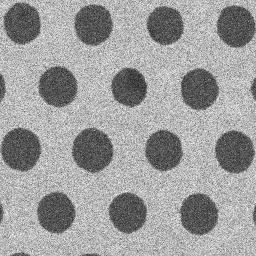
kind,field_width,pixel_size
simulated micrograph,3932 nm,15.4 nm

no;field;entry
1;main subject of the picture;a regular array of holes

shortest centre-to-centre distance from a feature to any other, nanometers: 1090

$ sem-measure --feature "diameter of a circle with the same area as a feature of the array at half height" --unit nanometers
625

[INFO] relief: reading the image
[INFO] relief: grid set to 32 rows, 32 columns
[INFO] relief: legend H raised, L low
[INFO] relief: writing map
HHLLHHHHHHHLHHHHHHHHHHHHHHHHHHHH
HLLLLHHHHHLLLLHHHHHLLLHHHHHHLLLH
LLLLLHHHHLLLLLHHHHLLLLLHHHHLLLLL
LLLLLHHHHLLLLLHHHHLLLLLHHHHLLLLL
HLLLLHHHHHLLLLHHHHHLLLLHHHHLLLLL
HHLLHHHHHHHLLHHHHHHHLLHHHHHHLLLH
HHHHHHHHHHHHHHHHHHHHHHHHHHHHHHHH
HHHHHHHHHHHHHHHHHHHHHHHHHHHHHHHH
HHHHHHLLHHHHHHHHHHHHHHHHHHHHHHHH
HHHHHLLLLHHHHHLLLLHHHHHLLLLHHHHH
LHHHHLLLLLHHHHLLLLHHHHHLLLLHHHHL
LHHHHLLLLLHHHHLLLLHHHHHLLLLHHHHL
HHHHHLLLLHHHHHLLLLHHHHHLLLLHHHHH
HHHHHHHLHHHHHHHHHHHHHHHHLLHHHHHH
HHHHHHHHHHHHHHHHHHHHHHHHHHHHHHHH
HHHHHHHHHHHHHHHHHHHHHHHHHHHHHHHH
HLLLHHHHHHLLLHHHHHHLLHHHHHHHLLHH
LLLLLHHHHLLLLLHHHHLLLLLHHHHLLLLH
LLLLLHHHHLLLLLHHHHLLLLLHHHHLLLLL
LLLLLHHHHLLLLLHHHHLLLLLHHHHLLLLL
HLLLLHHHHHLLLLHHHHHLLLHHHHHLLLLH
HHHHHHHHHHHLHHHHHHHHHHHHHHHHLLHH
HHHHHHHHHHHHHHHHHHHHHHHHHHHHHHHH
HHHHHHHHHHHHHHHHHHHHHHHHHHHHHHHH
HHHHHHLLHHHHHHHLLHHHHHHHLLHHHHHH
HHHHHLLLLHHHHHLLLLHHHHHLLLLHHHHH
HHHHHLLLLLHHHHLLLLHHHHLLLLLHHHHH
HHHHHLLLLHHHHHLLLLHHHHHLLLLHHHHH
HHHHHLLLLHHHHHLLLLHHHHHLLLLHHHHH
HHHHHHHHHHHHHHHHHHHHHHHHHHHHHHHH
HHHHHHHHHHHHHHHHHHHHHHHHHHHHHHHH
HHHHHHHHHHHHHHHHHHHHHHHHHHHHHHHH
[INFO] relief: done